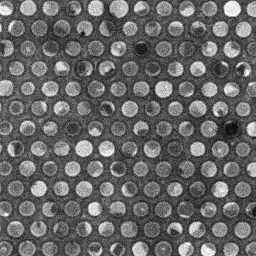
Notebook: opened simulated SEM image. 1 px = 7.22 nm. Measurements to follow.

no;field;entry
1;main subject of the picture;a regular array of raised bodies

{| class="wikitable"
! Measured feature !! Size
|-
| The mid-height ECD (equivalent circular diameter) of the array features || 14.9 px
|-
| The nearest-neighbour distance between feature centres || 161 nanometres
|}